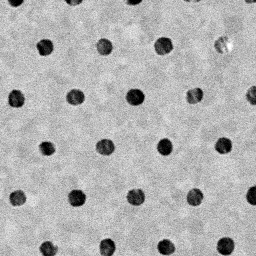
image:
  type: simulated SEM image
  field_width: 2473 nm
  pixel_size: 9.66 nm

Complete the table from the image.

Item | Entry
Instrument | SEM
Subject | a regular array of holes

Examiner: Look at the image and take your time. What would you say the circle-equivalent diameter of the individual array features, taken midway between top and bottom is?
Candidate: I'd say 0.176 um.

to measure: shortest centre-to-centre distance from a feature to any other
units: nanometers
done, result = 561